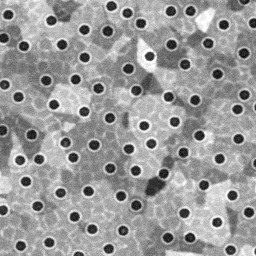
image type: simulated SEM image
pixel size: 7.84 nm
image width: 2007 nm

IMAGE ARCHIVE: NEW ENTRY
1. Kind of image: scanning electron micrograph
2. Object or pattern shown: a regular array of holes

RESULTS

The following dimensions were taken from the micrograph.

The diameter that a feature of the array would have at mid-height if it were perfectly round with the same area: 91.9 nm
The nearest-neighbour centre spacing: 0.188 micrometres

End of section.